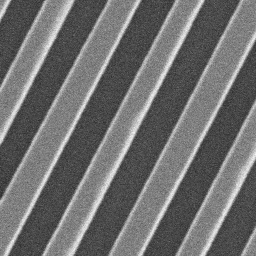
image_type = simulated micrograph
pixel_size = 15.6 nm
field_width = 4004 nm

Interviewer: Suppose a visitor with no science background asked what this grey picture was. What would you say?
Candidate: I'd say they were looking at lines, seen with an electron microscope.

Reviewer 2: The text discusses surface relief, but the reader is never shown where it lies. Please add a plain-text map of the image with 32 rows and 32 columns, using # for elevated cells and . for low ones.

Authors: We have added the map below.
#....####....####.....###.....##
.....###.....####....####....###
....####....####.....###.....###
....###.....####....####....####
...####....####.....###.....####
...###.....####....####....#####
..####....####.....###.....####.
..###.....####....####....#####.
.####....####.....###.....####..
.###....#####....####....####...
####....####....####.....####...
###....#####....####....####....
###....####.....###.....####....
##....#####....####....####.....
##....####....####.....####....#
#....####.....###.....####....##
#....####....####.....####....##
....####.....###.....####....###
....####....####.....####....###
...####.....###.....####....####
...####....####.....####....###.
..####.....###.....####....####.
.#####....####....#####....###..
.####.....###.....####....####..
#####....####....#####....###...
####.....###.....####....####...
####....####....####.....###....
###.....###.....####....####....
###....####....####.....###.....
##.....###.....####....####....#
##....####....####.....###.....#
#.....###.....####....####....##